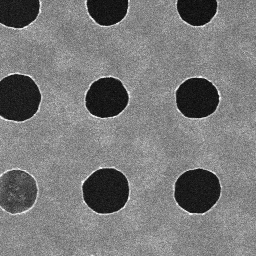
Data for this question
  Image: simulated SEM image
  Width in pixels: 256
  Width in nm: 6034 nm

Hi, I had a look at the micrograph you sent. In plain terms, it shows holes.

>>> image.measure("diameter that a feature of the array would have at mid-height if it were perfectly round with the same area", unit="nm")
1040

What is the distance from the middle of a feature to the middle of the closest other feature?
2.14 µm